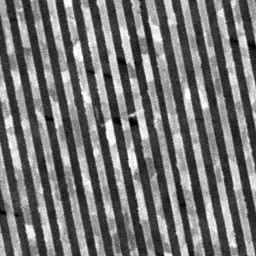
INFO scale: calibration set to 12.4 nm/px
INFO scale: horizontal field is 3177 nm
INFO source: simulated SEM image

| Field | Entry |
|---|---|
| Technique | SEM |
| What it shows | parallel lines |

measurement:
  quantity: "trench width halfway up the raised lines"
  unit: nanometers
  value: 123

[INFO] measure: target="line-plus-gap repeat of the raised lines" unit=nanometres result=203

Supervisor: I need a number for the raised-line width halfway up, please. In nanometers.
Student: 84.4